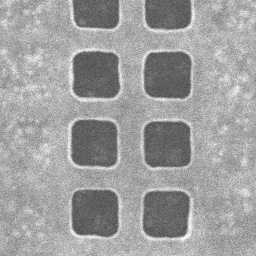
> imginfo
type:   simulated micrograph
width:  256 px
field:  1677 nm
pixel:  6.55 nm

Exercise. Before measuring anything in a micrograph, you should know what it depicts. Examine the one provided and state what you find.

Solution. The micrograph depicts holes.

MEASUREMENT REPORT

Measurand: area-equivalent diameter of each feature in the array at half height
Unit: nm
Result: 344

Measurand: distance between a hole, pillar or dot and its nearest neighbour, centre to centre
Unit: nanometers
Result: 455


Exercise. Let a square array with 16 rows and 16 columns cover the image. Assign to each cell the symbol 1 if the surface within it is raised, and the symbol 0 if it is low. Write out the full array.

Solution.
1111100110001111
1111100110001111
1111111111111111
1111100110001111
1111100110001111
1111100110001111
1111111111111111
1111100111111111
1111000110001111
1111000110001111
1111111111111111
1111111111111111
1111000110001111
1111000110001111
1111100110001111
1111111111111111